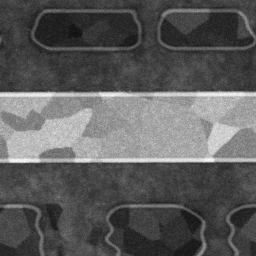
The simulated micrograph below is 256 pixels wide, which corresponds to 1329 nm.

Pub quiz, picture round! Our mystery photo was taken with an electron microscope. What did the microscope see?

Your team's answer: one or a few lines or trenches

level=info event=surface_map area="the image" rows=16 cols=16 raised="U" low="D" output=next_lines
DDDDDDDDDDDDDDDD
DDUUUUUUUDUUUUUD
DDUUUUUUUDUUUUUU
DDDDDDDDDDDDDDDD
DDDDDDDDDDDDDDDD
DDDDDDDDDDDDDDDD
UUUUUUUUUUUUUUUU
UUUUUUUUUUUUUUUU
UUUUUUUUUUUUUUUU
UUUUUUUUUUUUUUUU
DDDDDDDDDDDDDDDD
DDDDDDDDDDDDDDDD
DDDDDDDDDDDDDDDD
UUDDDDDUUUUUDDUU
UUDDDDDUUUUUUDDU
UUUDDDDUUUUUUDDU